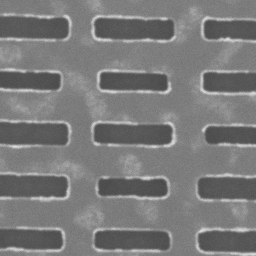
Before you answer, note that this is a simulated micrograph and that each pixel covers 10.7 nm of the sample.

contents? holes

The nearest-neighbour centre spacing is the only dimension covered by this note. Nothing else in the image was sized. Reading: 565 nm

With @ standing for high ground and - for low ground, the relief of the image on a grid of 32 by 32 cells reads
@@@@@@@@@@@@@@@@@@@@@@@@@@@@@@@@
@@@@@@@@@@@@@@@@@@@@@@@@@@@@@@@@
--------@@@@---------@@@@@-@@--@
---------@@@----------@@@-------
--------@@@@----------@@@@------
@@@@@@@@@@@@@@@@@@@@@@@@@@@@@@@@
@@@@@@@@@@@@@@@@@@@@@@@@@@@@@@@@
@@@@@@@@@@@@@@@@@@@@@@@@@@@@@@@@
@@@@@@@@@@@@@@@@@@@@@@@@@@@@@@@@
--------@@@@@--------@@@@-------
--------@@@@---------@@@@-------
@@@@@@@@@@@@@@@@@@@-@@@@@@------
@@@@@@@@@@@@@@@@@@@@@@@@@@@@@@@@
@@@@@@@@@@@@@@@@@@@@@@@@@@@@@@@@
@@@@@@@@@@@@@@@@@@@@@@@@@@@@@@@@
--------@@@@---@@@---@@@@@@@@@@@
---------@@@----------@@@@------
---------@@@----------@@@@------
@@@@@@@@@@@@@@@@@@@@@@@@@@@@@@@@
@@@@@@@@@@@@@@@@@@@@@@@@@@@@@@@@
@@@@@@@@@@@@@@@@@@@@@@@@@@@@@@@@
@@@@@@@@@@@@@@@@@@@@@@@@@@@@@@@@
---------@@@@--------@@@@-------
---------@@@---------@@@@-------
--------@@@@@-@@-----@@@@-------
@@@@@@@@@@@@@@@@@@@@@@@@@@@@@@@@
@@@@@@@@@@@@@@@@@@@@@@@@@@@@@@@@
@@@@@@@@@@@@@@@@@@@@@@@@@@@@@@@@
@@@@@@@@@@@@@@@@@@@@@@@@@@@@@@@@
--------@@@@---------@@@@-------
--------@@@@---------@@@@-------
@@@@@@@@@@@@@@@@@@@@@@@@@@------